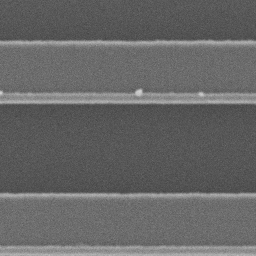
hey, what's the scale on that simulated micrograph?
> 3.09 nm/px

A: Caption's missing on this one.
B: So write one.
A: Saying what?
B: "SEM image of lines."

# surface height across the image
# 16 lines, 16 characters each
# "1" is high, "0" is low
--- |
0000000000000000
0000000000000000
0000000000000000
1111111111111111
1111111111111111
1111111111111111
0000000000000000
0000000000000000
0000000000000000
0000000000000000
0000000000000000
0000000000000000
1111111111111111
1111111111111111
1111111111111111
1111111111111111